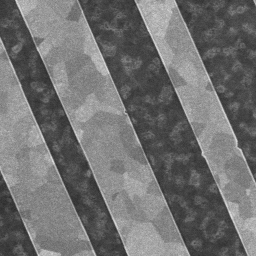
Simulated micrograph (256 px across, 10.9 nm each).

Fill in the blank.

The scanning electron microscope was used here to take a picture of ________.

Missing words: one or a few lines or trenches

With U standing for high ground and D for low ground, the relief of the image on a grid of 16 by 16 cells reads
DUUUUDDDDUUDDDDD
DDUUUDDDDUUUDDDD
DDUUUUDDDDUUDDDD
UDDUUUDDDDUUDDDD
UDDUUUUDDDUUUDDD
UDDUUUUDDDDUUDDD
UUDDUUUUDDDUUUDD
UUDDUUUUDDDDUUDD
UUUDDUUUUDDDUUUD
UUUDDUUUUDDDDUUD
UUUDDDUUUDDDDUUU
UUUUDDUUUUDDDDUU
DUUUDDDUUUDDDDUU
DUUUUDDUUUUDDDUU
DDUUUDDUUUUDDDDU
DDUUUUDDUUUUDDDU